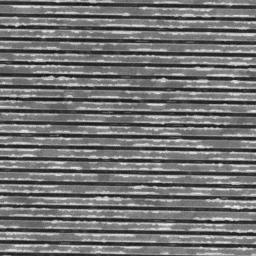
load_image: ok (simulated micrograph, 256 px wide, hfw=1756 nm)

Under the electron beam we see parallel lines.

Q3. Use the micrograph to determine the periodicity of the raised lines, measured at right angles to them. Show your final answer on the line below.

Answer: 81.8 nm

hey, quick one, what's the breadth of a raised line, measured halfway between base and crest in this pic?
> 0.0514 microns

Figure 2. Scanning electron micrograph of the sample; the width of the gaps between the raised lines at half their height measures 28.3 nm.